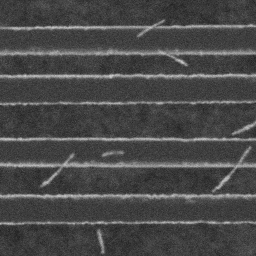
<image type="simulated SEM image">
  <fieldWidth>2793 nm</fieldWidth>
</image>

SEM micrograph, lines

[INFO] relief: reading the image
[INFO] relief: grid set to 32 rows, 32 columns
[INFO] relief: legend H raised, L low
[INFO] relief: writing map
LLLLLLLLLLLLLLLLLLLLLLLLLLLLLLLL
LLLLLLLLLLLLLLLLLLLLLLLLLLLLLLLL
LLLLLLLLLLLLLLLLLLLLLLLLLLLLLLLL
LLLLHHLLHHHHHHHHHHHHHHHHHHHHHHHH
HHHHHHHHHHHHHHHHHHHHHHHHHHHHHHHH
HHHHHHHHHHHHHHHHHHHHHHHHHHHHHHHH
HHHHHHHHHHHHHHHHHHHHHHHHHHHHHHHH
LLLLLLLLLLLLLLLLLLLLLLLLLLLLLLLL
LLLLLLLLLLLLLLLLLLLLLLLLLLLLLLLL
HHHHHHHHHHHHHHHHHHHHHHHHHHHHHHHH
HHHHHHHHHHHHHHHHHHHHHHHHHHHHHHHH
HHHHHHHHHHHHHHHHHHHHHHHHHHHHHHHH
HHHHHHHHHHHHHHHHHHHHHHHHHHHHHHHH
LLLLLLLLLLLLLLLLLLLLLLLLLLLLLLLL
LLLLLLLLLLLLLLLLLLLLLLLLLLLLLLLL
LLLLLLLLLLLLLLLLLLLLLLLLLLLLLLLL
LLLLLLLLLLLLLLLLLLLLLLLLLLLLLLLL
HHHHHHHHHHHHHHHHHHHHHHHHHHHHHHHH
HHHHHHHHHHHHHHHHHHHHHHHHHHHHHHHH
HHHHHHHHHHHHHHHHHHHHHHHHHHHHHHHH
HHHHHHHHHHHHHHHHHHHHHHHHHHHHHHHH
LLLLLLLLLLLLLLLLLLLLLLLLLLLLLLLL
LLLLLLLLLLLLLLLLLLLLLLLLLLLLLLLL
LLLLLLLLLLLLLLLLLLLLLLLLLLLLLLLL
LHHHHHLLHLLHHHLLHLLLLHHHLLLLHHHH
HHHHHHHHHHHHHHHHHHHHHHHHHHHHHHHH
HHHHHHHHHHHHHHHHHHHHHHHHHHHHHHHH
HHHHHHHHHHHHHHHHHHHHHHHHHHHHHHHH
LLLLLLLLLLLLLLLLLLLLLLLLLLLLLLLL
LLLLLLLLLLLLLLLLLLLLLLLLLLLLLLLL
LLLLLLLLLLLLLLLLLLLLLLLLLLLLLLLL
LLLLLLLLLLLLLLLLLLLLLLLLLLLLLLLL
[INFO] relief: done